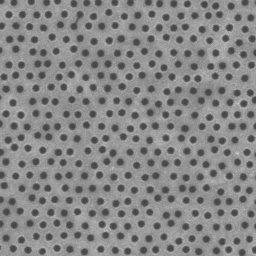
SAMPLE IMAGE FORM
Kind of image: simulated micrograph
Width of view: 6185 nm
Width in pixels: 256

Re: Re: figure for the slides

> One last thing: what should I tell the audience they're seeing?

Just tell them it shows a regular array of holes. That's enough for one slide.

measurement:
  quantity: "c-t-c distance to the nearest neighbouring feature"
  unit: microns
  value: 0.295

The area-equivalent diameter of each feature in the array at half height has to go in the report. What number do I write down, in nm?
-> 187